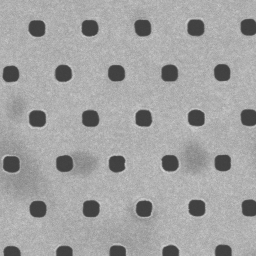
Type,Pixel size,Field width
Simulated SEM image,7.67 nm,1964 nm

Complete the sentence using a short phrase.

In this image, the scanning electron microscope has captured a regular array of holes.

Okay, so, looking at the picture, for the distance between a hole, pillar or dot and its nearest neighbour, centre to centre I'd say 400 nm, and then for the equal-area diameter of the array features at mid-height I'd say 132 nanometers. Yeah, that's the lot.